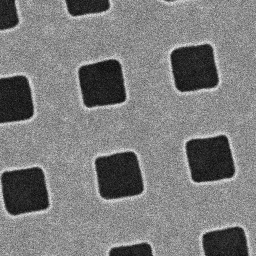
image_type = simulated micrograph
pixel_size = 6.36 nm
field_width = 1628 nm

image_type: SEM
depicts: holes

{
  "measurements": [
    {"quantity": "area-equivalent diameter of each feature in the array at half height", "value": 49.1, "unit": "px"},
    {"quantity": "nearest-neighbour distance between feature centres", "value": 0.589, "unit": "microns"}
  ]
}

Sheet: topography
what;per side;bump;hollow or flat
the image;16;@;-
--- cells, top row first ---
-@@@---@@@@@@@@@
-@@@@@@@@@@@@@@@
@@@@@@@@@@@@@@@@
@@@@@@@@@@@--@@@
@@@@@---@@@---@@
--@@@---@@@--@@@
--@@@--@@@@@@@@@
--@@@@@@@@@@@@@@
@@@@@@@@@@@@@@@@
@@@@@@@@@@@@--@@
@@@@@@---@@@---@
---@@@---@@@@@@@
---@@@@@@@@@@@@@
@@@@@@@@@@@@@@@@
@@@@@@@@@@@@@--@
@@@@@@@--@@@@---